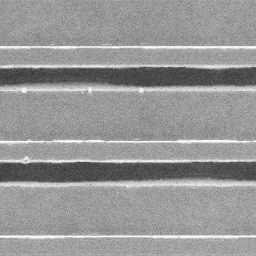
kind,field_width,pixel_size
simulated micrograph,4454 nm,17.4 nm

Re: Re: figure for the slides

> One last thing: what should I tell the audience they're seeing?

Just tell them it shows lines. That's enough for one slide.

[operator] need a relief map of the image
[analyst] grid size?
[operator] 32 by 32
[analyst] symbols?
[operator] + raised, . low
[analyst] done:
++++++++++++++++++++++++++++++++
++++++++++++++++++++++++++++++++
++++++++++++++++++++++++++++++++
++++++++++++++++++++++++++++++++
++++++++++++++++++++++++++++++++
++++++++++++++++++++++++++++++++
++++++++++++++++++++++++++++++++
++++++++++++++++++++++++++++++++
................................
................................
................................
++++++++++++++++++++++++++++++++
++++++++++++++++++++++++++++++++
++++++++++++++++++++++++++++++++
++++++++++++++++++++++++++++++++
++++++++++++++++++++++++++++++++
++++++++++++++++++++++++++++++++
++++++++++++++++++++++++++++++++
++++++++++++++++++++++++++++++++
++++++++++++++++++++++++++++++++
................................
................................
................................
++++++++++++++++++++++++++++++++
++++++++++++++++++++++++++++++++
++++++++++++++++++++++++++++++++
++++++++++++++++++++++++++++++++
++++++++++++++++++++++++++++++++
++++++++++++++++++++++++++++++++
++++++++++++++++++++++++++++++++
++++++++++++++++++++++++++++++++
++++++++++++++++++++++++++++++++